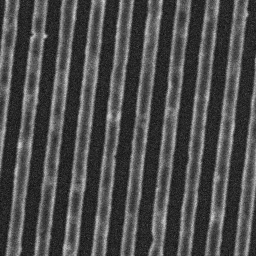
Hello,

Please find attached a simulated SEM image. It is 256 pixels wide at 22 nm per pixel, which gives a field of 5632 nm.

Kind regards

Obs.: parallel lines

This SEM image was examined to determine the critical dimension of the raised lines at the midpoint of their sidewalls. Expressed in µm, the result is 0.284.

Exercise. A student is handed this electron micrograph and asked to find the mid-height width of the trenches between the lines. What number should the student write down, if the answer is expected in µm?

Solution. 0.351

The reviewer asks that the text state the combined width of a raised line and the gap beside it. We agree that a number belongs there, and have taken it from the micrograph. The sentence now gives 0.624 µm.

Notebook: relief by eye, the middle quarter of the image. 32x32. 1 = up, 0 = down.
10000111000001100000111000011100
10000111000011100001111000011100
10000111000011100001110000111100
10000111000011100001110000111000
10000111000011100001110000111000
10000111000011100001110000111000
10000111000011100001110000111000
10001111000011100001110000111000
00001110000111000001110000111000
00001110000111000011100000111000
00001110000111000011100000111000
00001110000111000011100001110000
00001110000111000011100001110000
00001110000111000011100001110000
00001110000111000011100001110000
00001110000111000011100001110000
00011110000111000011100001110000
00011110000110000111100001110000
00011100000110000011000001110000
00011100001110000111000001110000
00011100001110000111000011100001
00011100001110000111000011100001
00011100001110000111000011100001
00011100001100000111000011100001
00011100001100000111000011100001
00111100001100000111000011100001
00111000001100000111000011100001
00111000011100000111000011100001
00111000011100001110000111100001
00111000011100001110000111000011
00111000011100001110000011000001
00111000011100001110000111000011